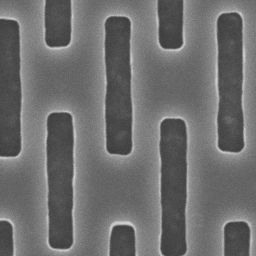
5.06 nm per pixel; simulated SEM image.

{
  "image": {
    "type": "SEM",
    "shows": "holes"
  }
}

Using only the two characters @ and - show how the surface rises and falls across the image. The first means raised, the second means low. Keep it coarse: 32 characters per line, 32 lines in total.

@@@@@@---@@@@@@@@@@@---@@@@@@@@@
@@@@@@---@@@@@@@@@@@---@@@@@@@@@
--@@@@---@@@@---@@@@---@@@@---@@
--@@@@---@@@@---@@@@---@@@@---@@
---@@@---@@@@---@@@@---@@@@---@@
---@@@---@@@@---@@@@---@@@@---@@
---@@@@@@@@@@---@@@@@@@@@@@---@@
---@@@@@@@@@@---@@@@@@@@@@@---@@
---@@@@@@@@@@---@@@@@@@@@@@---@@
---@@@@@@@@@@---@@@@@@@@@@@---@@
---@@@@@@@@@@---@@@@@@@@@@@---@@
---@@@@@@@@@@---@@@@@@@@@@@---@@
---@@@@@@@@@@----@@@@@@@@@@---@@
---@@@@@@@@@@----@@@@@@@@@@---@@
---@@@---@@@@----@@@@@@@@@@---@@
---@@@---@@@@----@@@---@@@@---@@
---@@@---@@@@----@@@---@@@@---@@
---@@@---@@@@----@@@----@@@---@@
---@@@---@@@@----@@@---@@@@---@@
--@@@@---@@@@@@@@@@@---@@@@@@@@@
@@@@@@---@@@@@@@@@@@---@@@@@@@@@
@@@@@@---@@@@@@@@@@@---@@@@@@@@@
@@@@@@---@@@@@@@@@@@---@@@@@@@@@
@@@@@@---@@@@@@@@@@@---@@@@@@@@@
@@@@@@---@@@@@@@@@@@---@@@@@@@@@
@@@@@@---@@@@@@@@@@@---@@@@@@@@@
@@@@@@---@@@@@@@@@@@---@@@@@@@@@
@@@@@@---@@@@@@@@@@@---@@@@@@@@@
--@@@@---@@@@@---@@@---@@@@@---@
--@@@@---@@@@@---@@@---@@@@@---@
--@@@@---@@@@@---@@@---@@@@@---@
--@@@@@@@@@@@@---@@@---@@@@@---@